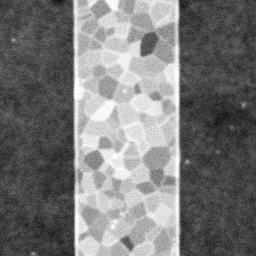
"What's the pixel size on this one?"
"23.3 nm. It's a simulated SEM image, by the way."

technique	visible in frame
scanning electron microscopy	wiring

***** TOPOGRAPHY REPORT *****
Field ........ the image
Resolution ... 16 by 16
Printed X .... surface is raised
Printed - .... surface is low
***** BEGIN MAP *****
-----XXXXXX-----
-----XXXXXX-----
-----XXXXXX-----
-----XXXXXX-----
-----XXXXXX-----
-----XXXXXX-----
-----XXXXXX-----
-----XXXXXX-----
-----XXXXXX-----
-----XXXXXX-----
-----XXXXXX-----
-----XXXXXX-----
-----XXXXXX-----
-----XXXXXX-----
-----XXXXXX-----
-----XXXXXX-----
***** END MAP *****